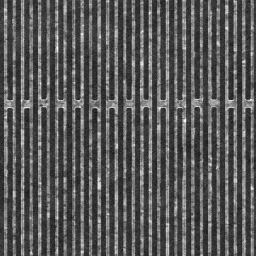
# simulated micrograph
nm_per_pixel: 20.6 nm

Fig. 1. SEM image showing parallel lines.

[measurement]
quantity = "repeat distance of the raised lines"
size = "175 nm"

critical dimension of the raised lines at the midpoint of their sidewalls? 48.8 nm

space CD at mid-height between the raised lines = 0.121 um